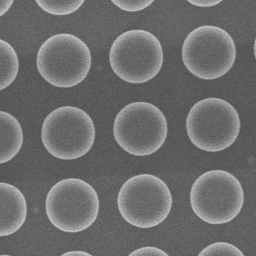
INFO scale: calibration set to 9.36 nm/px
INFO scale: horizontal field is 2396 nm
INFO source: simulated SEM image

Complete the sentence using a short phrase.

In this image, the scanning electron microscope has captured an array of small figures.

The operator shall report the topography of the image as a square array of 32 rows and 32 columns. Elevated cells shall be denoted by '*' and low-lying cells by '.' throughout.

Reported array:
*....*****....*****.....***.....
*.....***.......................
................................
.........................**.....
.......**......****.....*****...
*....******...******...******...
**...******...******...******...
**...******...******...******...
**...******...******...******...
**...******....****......**.....
*.....****......................
................................
.........................***....
.......***.....*****....*****...
*.....*****....*****....******..
**...*******..*******..*******..
***..*******..*******..*******..
***..*******...******...*****...
***...*****....*****.....***....
**.....***......................
................................
..........................**....
........**......****.....*****..
**.....*****...******...******..
***...******...******...******..
***...******...******...******..
***...******...******...******..
***...******....****.....****...
**.....****.....................
................................
...........................**...
.........*.......***.....*****..